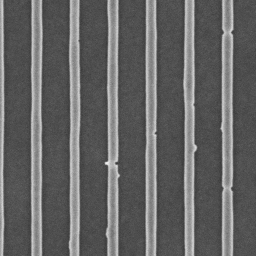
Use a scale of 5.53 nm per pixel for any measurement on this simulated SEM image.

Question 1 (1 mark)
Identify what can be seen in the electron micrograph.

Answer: parallel lines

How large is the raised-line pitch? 0.21 um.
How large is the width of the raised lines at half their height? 56 nm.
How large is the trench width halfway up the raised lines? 157 nanometres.